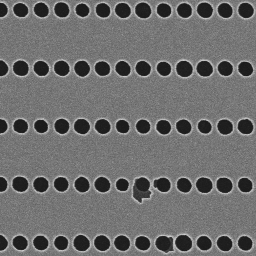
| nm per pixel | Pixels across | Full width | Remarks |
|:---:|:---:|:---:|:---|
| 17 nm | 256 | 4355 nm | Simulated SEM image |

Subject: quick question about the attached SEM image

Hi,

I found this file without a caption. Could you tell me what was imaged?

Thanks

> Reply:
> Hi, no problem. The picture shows a regular array of holes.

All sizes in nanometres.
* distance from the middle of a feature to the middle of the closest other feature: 345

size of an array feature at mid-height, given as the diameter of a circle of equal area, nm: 262